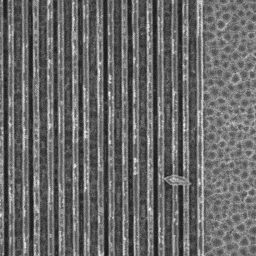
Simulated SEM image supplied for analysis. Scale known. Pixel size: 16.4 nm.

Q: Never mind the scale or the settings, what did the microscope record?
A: parallel lines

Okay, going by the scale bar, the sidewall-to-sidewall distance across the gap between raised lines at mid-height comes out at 7.5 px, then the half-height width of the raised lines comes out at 90.1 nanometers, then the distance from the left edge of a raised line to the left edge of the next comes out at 206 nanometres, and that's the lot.